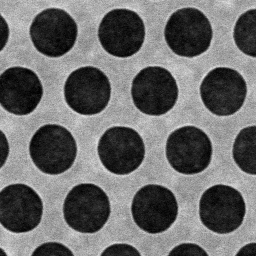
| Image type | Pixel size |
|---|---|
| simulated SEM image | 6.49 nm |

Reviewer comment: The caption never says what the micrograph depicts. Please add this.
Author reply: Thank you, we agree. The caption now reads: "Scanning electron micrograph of a regular array of holes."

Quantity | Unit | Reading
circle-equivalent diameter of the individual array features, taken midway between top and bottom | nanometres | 310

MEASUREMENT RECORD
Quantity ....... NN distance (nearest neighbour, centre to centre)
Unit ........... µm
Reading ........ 0.436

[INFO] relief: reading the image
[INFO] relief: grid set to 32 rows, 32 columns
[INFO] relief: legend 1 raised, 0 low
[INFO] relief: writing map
11111111111111111111111111111111
11111000111111000111110001111110
01110000011110000011100000111100
01110000001100000011100000111000
01110000001100000011100000111000
01110000011110000011100000111100
11111000111110000111110001111100
11111111111111111111111111111111
10011111110011111100111111100111
00000111100001111000001111000011
00000111000000110000001110000001
00000111000000110000001110000001
00000111000000111000001110000001
10001111100001111000011111000011
11111111111111111110111111111111
11111111111111111111111111111111
11110000011110000111110001111100
01110000011100000011100000111000
01110000001100000011100000011000
01110000001100000011100000111000
11110000011110000011100000111100
11111000111111001111110001111110
11111111111111111111111111111111
10001111100011111100011111000111
00000111000001111000001110000011
00000111000000110000001110000001
00000111000000110000001110000001
00000111000001111000001110000011
10001111100001111100011111000011
11111111111111111111111111111111
11111000111111001111111011111110
01110000011110000111100000111100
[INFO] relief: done